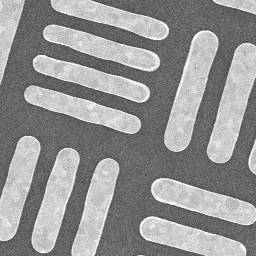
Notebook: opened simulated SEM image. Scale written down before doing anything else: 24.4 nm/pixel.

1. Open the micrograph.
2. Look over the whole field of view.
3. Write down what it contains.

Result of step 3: groups of lines, slits or small figures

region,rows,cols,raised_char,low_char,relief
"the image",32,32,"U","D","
UUUDDDDUUUUUUDDDDDDDDDDDDDDUUUUU
UUUDDDDDUUUUUUUUDDDDDDDDDDDDDDDU
UUDDDDDDDDDUUUUUUUUUDDDDDDDDDDDD
UUDDDDUUDDDDDDDUUUUUUDDDDDDDDDDD
UUDDDDUUUUUUDDDDDDUUUDDDDUUDDDDD
UDDDDDDDUUUUUUUDDDDDDDDDUUUDDDUD
UDDDDDDDDDUUUUUUUUUDDDDDUUUDDUUU
UDDDUUUDDDDDDDUUUUUUDDDUUUUDDUUU
UDDDUUUUUUUDDDDDDUUDDDDUUUDDDUUU
DDDDDDUUUUUUUUUDDDDDDDDUUUDDDUUU
DDDDDDDDDDUUUUUUUDDDDDDUUUDDUUUU
DDDUUUUDDDDDDUUUUUUDDDUUUDDDUUUD
DDDUUUUUUUUDDDDDDUDDDDUUUDDDUUUD
DDDDDDUUUUUUUUDDDDDDDDUUUDDUUUUD
DDDDDDDDDUUUUUUUUDDDDUUUUDDUUUDD
DDDDDDDDDDDDUUUUUUDDDUUUDDDUUUDD
DDDDDDDDDDDDDDDDUDDDDUUUDDDUUUDD
DDDUUDDDDDDDDDDDDDDDDUUUDDUUUDDD
DDUUUDDDDDDDDDDDDDDDDUUDDDUUUDDD
DDUUUDDUUUDDDDDDDDDDDDDDDDUUUDDU
DUUUDDDUUUDDUUUDDDDDDDDDDDDDDDDU
DUUUDDUUUDDDUUUDDDDDDDDDDDDDDDDD
DUUUDDUUUDDUUUUDDDDDUDDDDDDDDDDD
DUUUDDUUUDDUUUDDDDDUUUUUUDDDDDDD
UUUDDDUUUDDUUUDDDDDUUUUUUUUUDDDD
UUUDDUUUDDDUUUDDDDDDDDUUUUUUUUUD
UUUDDUUUDDDUUDDDDDDDDDDDDUUUUUUU
UUDDDUUUDDUUUDDDDDUUUDDDDDDDUUUU
UUDDUUUDDDUUUDDDDDUUUUUUDDDDDDDD
UUDDUUUDDUUUDDDDDDUUUUUUUUUDDDDD
DDDDUUUDDUUUDDDDDDDDUUUUUUUUUUDD
DDDDDUDDDUUUDDDDDDDDDDDDUUUUUUUD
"